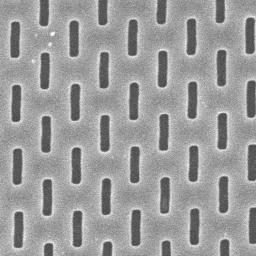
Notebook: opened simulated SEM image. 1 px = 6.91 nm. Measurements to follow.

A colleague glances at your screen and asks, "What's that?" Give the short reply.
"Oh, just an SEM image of a regular array of holes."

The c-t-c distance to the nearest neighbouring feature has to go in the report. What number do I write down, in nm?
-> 296